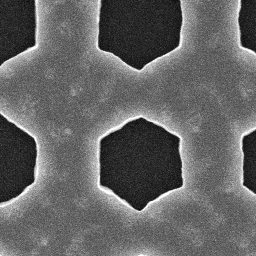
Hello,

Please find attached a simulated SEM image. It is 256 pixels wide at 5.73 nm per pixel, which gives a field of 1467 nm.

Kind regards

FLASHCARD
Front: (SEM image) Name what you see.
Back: holes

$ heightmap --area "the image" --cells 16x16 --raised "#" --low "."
..####.....####.
..####.....####.
..####.....####.
.######...######
################
################
################
.#######.#######
..#####....####.
..####.....####.
..####.....####.
..####.....####.
.#######..######
################
################
################